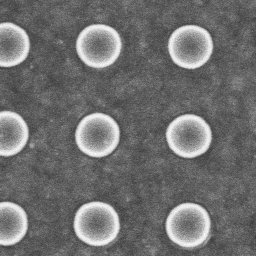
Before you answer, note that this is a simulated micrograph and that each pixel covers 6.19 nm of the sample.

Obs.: raised bodies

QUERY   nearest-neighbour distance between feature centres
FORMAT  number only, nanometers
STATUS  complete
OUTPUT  550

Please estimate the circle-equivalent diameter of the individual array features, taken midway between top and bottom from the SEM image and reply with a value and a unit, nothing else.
254 nm